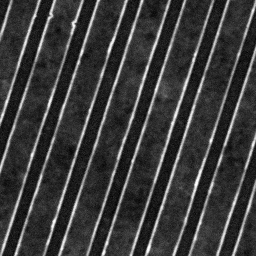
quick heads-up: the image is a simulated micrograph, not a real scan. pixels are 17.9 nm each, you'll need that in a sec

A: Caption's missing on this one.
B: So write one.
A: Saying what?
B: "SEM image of parallel lines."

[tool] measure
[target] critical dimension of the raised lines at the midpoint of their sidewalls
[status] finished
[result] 499 nm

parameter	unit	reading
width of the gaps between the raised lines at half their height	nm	241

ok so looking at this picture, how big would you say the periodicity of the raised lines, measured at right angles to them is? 741 nm